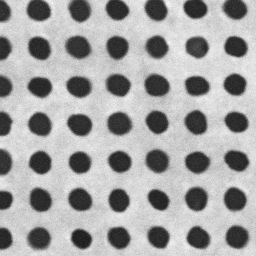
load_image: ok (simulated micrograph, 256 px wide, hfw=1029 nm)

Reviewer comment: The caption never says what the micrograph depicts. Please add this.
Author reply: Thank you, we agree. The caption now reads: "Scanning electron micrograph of a regular array of holes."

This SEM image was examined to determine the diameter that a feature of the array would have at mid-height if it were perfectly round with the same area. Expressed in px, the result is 22.6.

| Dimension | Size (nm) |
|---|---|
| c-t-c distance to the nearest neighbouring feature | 151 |